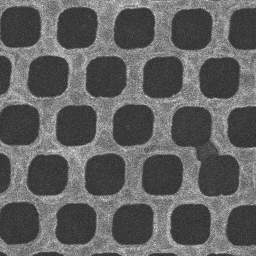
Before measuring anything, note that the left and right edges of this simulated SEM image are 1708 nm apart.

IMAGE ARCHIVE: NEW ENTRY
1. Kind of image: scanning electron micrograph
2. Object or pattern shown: a regular array of holes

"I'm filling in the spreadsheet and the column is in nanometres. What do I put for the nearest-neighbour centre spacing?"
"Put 376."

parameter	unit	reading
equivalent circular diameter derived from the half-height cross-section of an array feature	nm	291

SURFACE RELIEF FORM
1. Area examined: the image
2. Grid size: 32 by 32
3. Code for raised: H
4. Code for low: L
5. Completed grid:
HHHHHHHHHHHHHHHHHHHHHHHHHHHHHHHH
LLLLLHHHLLLLHHHLLLLHHHLLLLHHHLLL
LLLLLHHLLLLLHHLLLLLHHHLLLLLHHLLL
LLLLLHHLLLLLHHLLLLLHHLLLLLHHHLLL
LLLLLHHLLLLLHHLLLLLHHLLLLLHHHLLL
LLLLHHHLLLLLHHLLLLLHHHLLLLHHHLLL
HHHHHHHHHHHHHHHHHHHHHHHHHHHHHHHH
LHHHLLLLHHHHLLLHHHHLLLHHHHLLLHHH
LLHHLLLLLHHLLLLLHHLLLLLHHLLLLLHH
LHHHLLLLHHHLLLLLHHLLLLLHHLLLLLHH
LHHLLLLLHHHLLLLLHHLLLLLHHLLLLLHH
LHHHLLLLHHHLLLLHHHLLLLHHHLLLLLHH
HHHHHHHHHHHHHHHHHHHHHHHHHHHHHHHH
HLLLHHHHLLLLHHHLLLLHHHHLLLHHHLLL
LLLLLHHLLLLLHHLLLLLHHHLLLLHHHLLL
LLLLLHHLLLLLHHLLLLLHHLLLLLHHLLLL
LLLLLHHLLLLLHHLLLLLHHLLLLLHHLLLL
LLLLHHHLLLLLHHLLLLLHHHLLLLHHHLLL
HHHHHHHHHHHHHHHHHHHHHHHHLLLHHHHH
LHHHHLLLHHHHLLLHHHHLLLHHHLLLLHHH
LHHHLLLLLHHLLLLLHHLLLLLHHLLLLLHH
LHHLLLLLLHHLLLLLHHLLLLLHHLLLLLHH
LHHLLLLLHHHLLLLLHHLLLLLHHLLLLLHH
LHHHLLLLHHHLLLLHHHLLLLHHHLLLLLHH
HHHHHHHHHHHHHHHHHHHHHHHHHHLHHHHH
HLLLHHHHHLLHHHHHLLHHHHHLLHHHHHHH
LLLLLHHLLLLLHHHLLLLHHLLLLLHHHLLL
LLLLLHHLLLLLHHLLLLLHHLLLLLHHLLLL
LLLLLHHLLLLLHHLLLLLHHLLLLLHHLLLL
LLLLLHHLLLLLHHLLLLLHHLLLLLHHLLLL
HLLHHHHHLLLHHHHLLLHHHHLLLHHHHLLL
HHHHHLLHHHHHHLHHHHHHHHHHHHHHHHHH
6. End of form